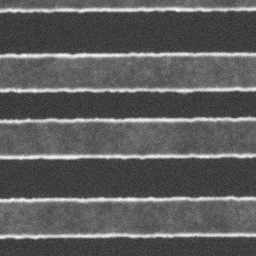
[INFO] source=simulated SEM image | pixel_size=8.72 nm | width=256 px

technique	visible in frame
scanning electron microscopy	lines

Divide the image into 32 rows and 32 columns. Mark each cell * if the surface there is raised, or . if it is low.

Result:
********************************
................................
................................
................................
................................
................................
................................
********************************
********************************
********************************
********************************
................................
................................
................................
................................
********************************
********************************
********************************
********************************
********************************
................................
................................
................................
................................
................................
********************************
********************************
********************************
********************************
************....***.............
................................
................................